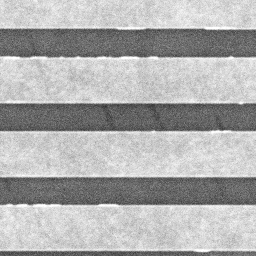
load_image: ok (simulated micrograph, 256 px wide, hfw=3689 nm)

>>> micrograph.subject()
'lines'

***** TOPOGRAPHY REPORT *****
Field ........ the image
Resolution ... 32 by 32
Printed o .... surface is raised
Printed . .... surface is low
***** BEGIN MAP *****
oooooooooooooooooooooooooooooooo
oooooooooooooooooooooooooooooooo
oooooooooooooooooooooooooooooooo
..............oooo.......ooooooo
................................
................................
................................
oooooooooooooooooooooooooooooooo
oooooooooooooooooooooooooooooooo
oooooooooooooooooooooooooooooooo
oooooooooooooooooooooooooooooooo
oooooooooooooooooooooooooooooooo
oooooooooooooooooooooooooooooooo
................................
................................
................................
...........................oo...
oooooooooooooooooooooooooooooooo
oooooooooooooooooooooooooooooooo
oooooooooooooooooooooooooooooooo
oooooooooooooooooooooooooooooooo
oooooooooooooooooooooooooooooooo
................................
................................
................................
................................
oooooooooooooooooooooooooooooooo
oooooooooooooooooooooooooooooooo
oooooooooooooooooooooooooooooooo
oooooooooooooooooooooooooooooooo
oooooooooooooooooooooooooooooooo
................................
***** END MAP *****